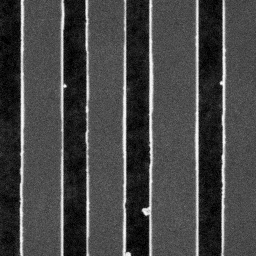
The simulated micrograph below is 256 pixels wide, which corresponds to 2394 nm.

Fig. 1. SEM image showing lines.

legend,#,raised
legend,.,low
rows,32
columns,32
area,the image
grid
...#####...#####...######...####
...#####...#####...######...####
...#####...#####...######...####
...#####...#####...######...####
...#####...#####...######...####
...#####...#####...######...####
...#####...#####...######...####
...#####...#####...######...####
...#####...#####...######...####
...#####...#####...######...####
...#####...#####...######...####
...#####...#####...######...####
...#####...#####...######...####
...#####...#####...######...####
...#####...#####...######...####
...#####...#####...######...####
...#####...#####...######...####
...#####...#####...######...####
...#####...#####...######...####
...#####...#####...######...####
...#####...#####...######...####
...#####...#####...######...####
...#####...#####...######...####
...#####...#####...######...####
...#####...#####...######...####
...#####...#####...######...####
...#####...#####...######...####
...#####...#####...######...####
...#####...#####...######...####
...#####...#####...######...####
...#####...#####...######...####
...#####...#####...######...####